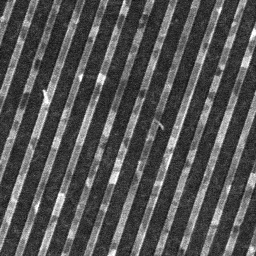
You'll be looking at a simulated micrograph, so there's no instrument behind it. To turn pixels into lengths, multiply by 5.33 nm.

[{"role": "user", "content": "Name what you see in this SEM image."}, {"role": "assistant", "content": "parallel lines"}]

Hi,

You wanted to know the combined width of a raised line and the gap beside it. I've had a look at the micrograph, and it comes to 117 nm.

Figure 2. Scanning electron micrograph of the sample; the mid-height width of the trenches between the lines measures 80.1 nanometers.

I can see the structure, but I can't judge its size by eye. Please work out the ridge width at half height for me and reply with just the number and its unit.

34.7 nm